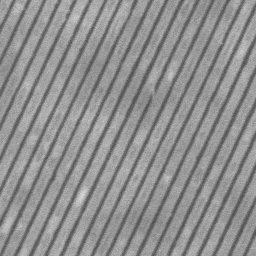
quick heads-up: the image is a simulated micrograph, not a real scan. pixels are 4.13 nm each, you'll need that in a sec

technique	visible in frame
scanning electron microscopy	parallel lines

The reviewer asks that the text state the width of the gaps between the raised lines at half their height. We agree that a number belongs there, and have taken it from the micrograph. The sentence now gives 16.4 nanometres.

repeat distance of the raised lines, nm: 57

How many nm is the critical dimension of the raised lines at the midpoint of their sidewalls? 40.6